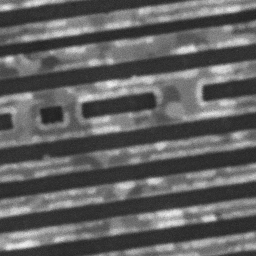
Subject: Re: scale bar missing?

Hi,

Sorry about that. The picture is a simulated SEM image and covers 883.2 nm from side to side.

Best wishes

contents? parallel lines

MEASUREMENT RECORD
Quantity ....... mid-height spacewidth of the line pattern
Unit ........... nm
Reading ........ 59.3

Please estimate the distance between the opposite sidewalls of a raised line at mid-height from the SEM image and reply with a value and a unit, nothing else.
16.2 pixels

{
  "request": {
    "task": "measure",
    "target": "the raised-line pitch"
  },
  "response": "118 nanometres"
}